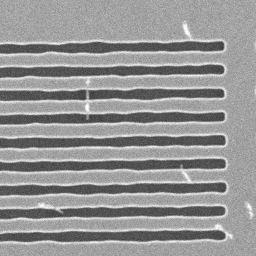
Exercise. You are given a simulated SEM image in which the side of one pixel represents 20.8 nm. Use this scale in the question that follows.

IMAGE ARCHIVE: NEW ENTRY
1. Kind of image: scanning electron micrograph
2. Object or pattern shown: groups of lines, slits or small figures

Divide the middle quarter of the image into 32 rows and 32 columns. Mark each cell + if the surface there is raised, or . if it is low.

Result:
+++++++++++++...+...++++........
................................
................................
++++++++++++++++++++++++++++++++
++++++++++++++++++++++++++++++++
++++++++++++++++++++++++++++++++
.++.............................
................................
..........................+++++.
++++++++++++++++++++++++++++++++
++++++++++++++++++++++++++++++++
++++++++++++++++++++++++++++++++
.....+..........................
................................
................................
++++++++++++++++++++++++++++++++
++++++++++++++++++++++++++++++++
++++++++++++++++++++++++++++++++
................................
................................
................................
++++++++++++++++++++++++++++++++
++++++++++++++++++++++++++++++++
++++++++++++++++++++++++++++++++
................................
................................
.......++++.+++++....+++++++++++
++++++++++++++++++++++++++++++++
++++++++++++++++++++++++++++++++
++++++++++++++++++++++++++++++++
................................
................................